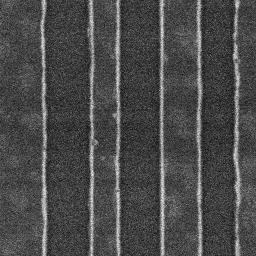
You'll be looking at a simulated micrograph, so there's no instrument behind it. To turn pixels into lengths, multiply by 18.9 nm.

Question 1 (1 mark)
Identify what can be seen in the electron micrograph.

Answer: one or a few lines or trenches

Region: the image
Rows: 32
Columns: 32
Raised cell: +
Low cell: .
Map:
++++++.....++++.....+++++.....++
+++++.......+++.....+++++.....++
+++++.......+++.....+++++....+++
+++++.......+++.....+++++....+++
+++++.......+++.....+++++....+++
+++++.......+++.....+++++....+++
+++++.......+++.....+++++....+++
+++++.......+++.....+++++....+++
+++++.......+++.....+++++.....++
+++++.......+++.....+++++.....++
+++++.......+++.....+++++.....++
+++++.......+++.....+++++.....++
+++++......++++.....+++++.....++
+++++......++++.....+++++.....++
++++++.....++++.....+++++.....++
+++++.......+++.....+++++.....++
++++++......+++.....+++++.....++
++++++.....++++.....+++++.....++
++++++......+++.....+++++.....++
++++++......+++.....+++++....+++
+++++.......+++.....+++++.....++
+++++.......+++.....+++++.....++
+++++.......+++.....+++++.....++
++++++......+++.....+++++.....++
++++++.....++++.....+++++.....++
+++++......++++.....+++++.....++
++++++.....++++.....+++++.....++
++++++.....++++.....+++++.....++
++++++.....++++.....+++++.....++
+++++......++++.....+++++.....++
+++++.......+++.....+++++.....++
+++++......++++.....+++++.....++